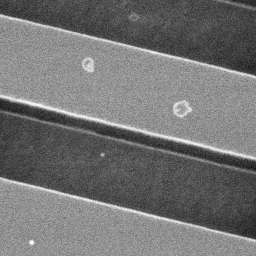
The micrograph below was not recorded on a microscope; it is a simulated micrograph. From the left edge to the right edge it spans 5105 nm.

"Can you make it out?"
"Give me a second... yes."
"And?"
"lines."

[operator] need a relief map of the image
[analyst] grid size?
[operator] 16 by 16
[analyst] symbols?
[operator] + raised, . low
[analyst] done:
................
++..............
+++++++.........
+++++++++++.....
+++++++++++++++.
++++++++++++++++
..++++++++++++++
......++++++++++
..........++++++
..............++
................
++..............
++++++..........
++++++++++......
++++++++++++++..
++++++++++++++++